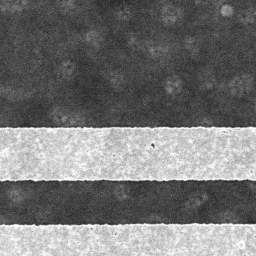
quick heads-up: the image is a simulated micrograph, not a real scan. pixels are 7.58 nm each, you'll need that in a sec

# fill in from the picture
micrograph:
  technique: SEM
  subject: one or a few lines or trenches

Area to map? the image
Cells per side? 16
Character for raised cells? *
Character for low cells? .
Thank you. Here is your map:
................
................
................
................
................
................
................
................
****************
****************
****************
................
................
................
****************
****************